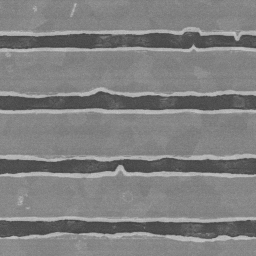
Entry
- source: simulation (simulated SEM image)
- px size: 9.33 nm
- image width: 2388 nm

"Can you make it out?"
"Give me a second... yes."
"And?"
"one or a few lines or trenches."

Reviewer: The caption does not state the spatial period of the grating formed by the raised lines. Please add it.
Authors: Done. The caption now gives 62.6 pixels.